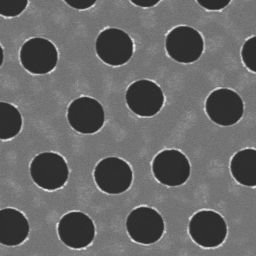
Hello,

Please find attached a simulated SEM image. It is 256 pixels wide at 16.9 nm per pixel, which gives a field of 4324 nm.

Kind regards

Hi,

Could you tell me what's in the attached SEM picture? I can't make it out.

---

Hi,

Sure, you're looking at a regular array of holes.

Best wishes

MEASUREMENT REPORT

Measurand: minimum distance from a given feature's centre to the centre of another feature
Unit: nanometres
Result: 1050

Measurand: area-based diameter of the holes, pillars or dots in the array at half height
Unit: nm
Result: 629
